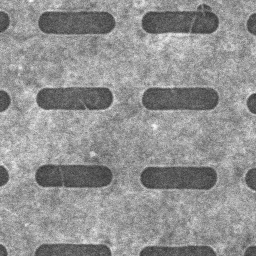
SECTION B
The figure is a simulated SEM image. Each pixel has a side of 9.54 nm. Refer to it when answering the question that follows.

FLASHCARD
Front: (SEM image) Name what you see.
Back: holes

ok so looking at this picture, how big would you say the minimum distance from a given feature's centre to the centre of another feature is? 735 nanometres